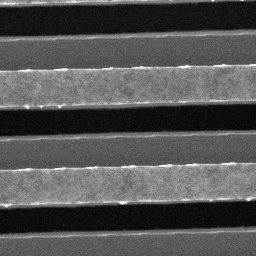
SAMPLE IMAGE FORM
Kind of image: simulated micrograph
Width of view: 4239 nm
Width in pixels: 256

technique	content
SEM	lines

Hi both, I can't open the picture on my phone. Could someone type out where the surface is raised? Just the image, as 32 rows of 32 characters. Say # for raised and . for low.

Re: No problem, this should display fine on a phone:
................................
................................
................................
................................
....................############
################################
################################
################################
################################
################################
################################
################################
################################
................................
................................
................................
................................
################################
################################
################################
################################
################################
################################
################################
################################
########.......#................
................................
................................
................................
......##########################
################################
################################